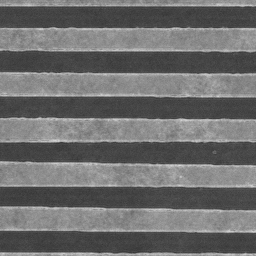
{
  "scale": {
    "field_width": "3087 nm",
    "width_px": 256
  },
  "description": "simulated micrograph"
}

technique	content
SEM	lines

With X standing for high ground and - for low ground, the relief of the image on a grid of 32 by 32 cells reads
XXXXXXXXXXXXXXXXXXXXXXXXXXXXXXXX
--------------------------------
--------------------------------
X-----X-XX-----------XXX--------
XXXXXXXXXXXXXXXXXXXXXXXXXXXXXXXX
XXXXXXXXXXXXXXXXXXXXXXXXXXXXXXXX
--------------------------------
--------------------------------
--------------------------------
XXXXXXXXXXXXXXXXXXXXXXXXXXXXXXXX
XXXXXXXXXXXXXXXXXXXXXXXXXXXXXXXX
XXXXXXXXXXXXXXXXXXXXXXXXXXXXXXXX
--------------------------------
--------------------------------
--------------------------------
XXXXXXXXXXXXXXXXXXXXXXXXXXXXXXXX
XXXXXXXXXXXXXXXXXXXXXXXXXXXXXXXX
XXXXXXXXXXXXXXXXXXXXXXXXXXXXXXXX
--------------------------------
--------------------------------
XXXXXXXXXXXXXXXXXXX-------------
XXXXXXXXXXXXXXXXXXXXXXXXXXXXXXXX
XXXXXXXXXXXXXXXXXXXXXXXXXXXXXXXX
--------------------------------
--------------------------------
--------------------------------
XXXXXXXXXXXXXXXXXXXXXXXXXXXXXXXX
XXXXXXXXXXXXXXXXXXXXXXXXXXXXXXXX
XXXXXXXXXXXXXXXXXXXXXXXXXXXXXXXX
--------------------------------
--------------------------------
--------------------------------